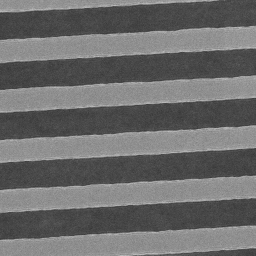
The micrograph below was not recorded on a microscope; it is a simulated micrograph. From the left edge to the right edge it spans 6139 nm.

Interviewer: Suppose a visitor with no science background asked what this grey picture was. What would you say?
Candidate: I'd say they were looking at lines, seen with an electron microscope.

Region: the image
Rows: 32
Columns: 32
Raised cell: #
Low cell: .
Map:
##################..............
................................
................................
............................####
.........#######################
################################
#######################.........
######..........................
................................
...............................#
.............###################
################################
##########################......
##########......................
................................
................................
.................###############
################################
###############################.
###############.................
................................
................................
.......................#########
......##########################
################################
##################..............
#...............................
................................
...........................#####
.........#######################
################################
########################........